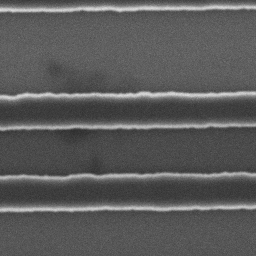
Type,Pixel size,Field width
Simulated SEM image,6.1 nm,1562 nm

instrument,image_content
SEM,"lines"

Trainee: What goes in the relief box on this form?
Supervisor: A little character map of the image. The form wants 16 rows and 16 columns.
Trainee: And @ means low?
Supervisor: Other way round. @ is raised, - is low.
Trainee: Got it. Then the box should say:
@@@@@@@@@@@@@@@@
----------------
----------------
----------------
----------------
----------------
@@@@@@@@@@@@@@@@
@@@@@@@@@@@@@@@@
----------------
----------------
----------------
@@@@@@@@@@@@@@@@
@@@@@@@@@@@@@@@@
----------------
----------------
----------------